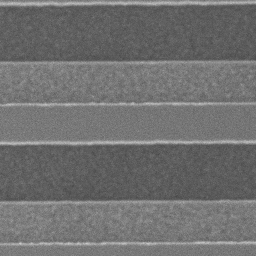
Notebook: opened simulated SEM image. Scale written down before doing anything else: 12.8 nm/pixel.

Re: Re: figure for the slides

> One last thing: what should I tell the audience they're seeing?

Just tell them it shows lines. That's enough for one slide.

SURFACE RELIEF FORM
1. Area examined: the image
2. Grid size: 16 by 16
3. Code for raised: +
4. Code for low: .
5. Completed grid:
................
................
................
................
++++++++++++++++
++++++++++++++++
++++++++++++++++
++++++++++++++++
++++++++++++++++
................
................
................
................
++++++++++++++++
++++++++++++++++
++++++++++++++++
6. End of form